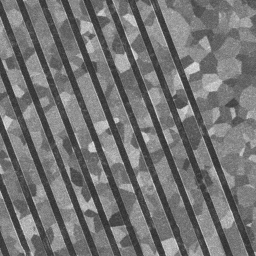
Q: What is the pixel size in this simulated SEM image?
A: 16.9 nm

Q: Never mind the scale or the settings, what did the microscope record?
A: parallel lines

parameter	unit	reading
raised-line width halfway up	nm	230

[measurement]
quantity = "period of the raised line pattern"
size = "0.351 µm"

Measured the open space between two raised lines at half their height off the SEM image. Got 124 nanometres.